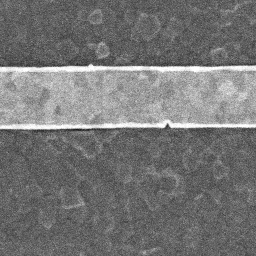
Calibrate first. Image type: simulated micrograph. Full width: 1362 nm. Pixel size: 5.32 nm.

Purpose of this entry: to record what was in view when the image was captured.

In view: one or a few lines or trenches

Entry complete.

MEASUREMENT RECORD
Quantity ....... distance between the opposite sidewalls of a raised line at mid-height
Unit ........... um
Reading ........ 0.315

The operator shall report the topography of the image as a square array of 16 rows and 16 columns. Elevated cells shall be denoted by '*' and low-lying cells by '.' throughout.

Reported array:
................
................
................
................
****************
****************
****************
****************
................
................
................
................
................
................
................
................